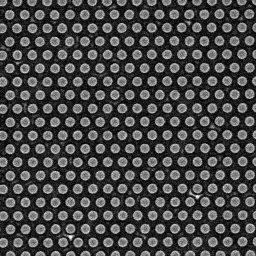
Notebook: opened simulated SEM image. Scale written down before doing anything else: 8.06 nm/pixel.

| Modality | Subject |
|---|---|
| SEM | a regular array of raised bodies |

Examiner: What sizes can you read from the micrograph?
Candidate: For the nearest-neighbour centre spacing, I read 119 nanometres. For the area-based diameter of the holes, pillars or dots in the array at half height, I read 73.9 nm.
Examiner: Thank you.